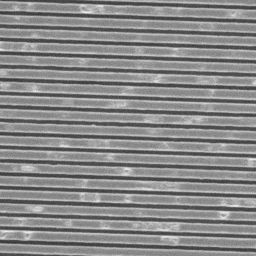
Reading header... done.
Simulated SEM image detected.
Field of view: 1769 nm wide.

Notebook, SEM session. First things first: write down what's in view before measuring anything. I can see parallel lines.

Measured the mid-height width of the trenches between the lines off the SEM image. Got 29.4 nm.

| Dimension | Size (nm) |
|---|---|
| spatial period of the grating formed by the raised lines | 93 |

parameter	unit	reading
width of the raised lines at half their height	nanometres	64.8